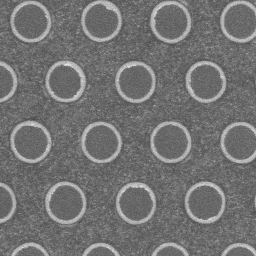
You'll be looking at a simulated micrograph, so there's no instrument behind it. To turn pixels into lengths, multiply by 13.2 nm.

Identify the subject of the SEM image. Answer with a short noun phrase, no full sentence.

a regular array of raised bodies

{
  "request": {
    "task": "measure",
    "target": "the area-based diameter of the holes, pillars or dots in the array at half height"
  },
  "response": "504 nanometers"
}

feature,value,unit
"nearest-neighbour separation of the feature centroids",917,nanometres